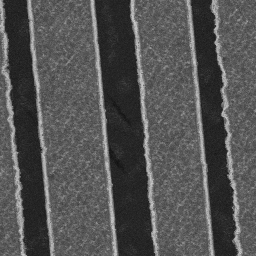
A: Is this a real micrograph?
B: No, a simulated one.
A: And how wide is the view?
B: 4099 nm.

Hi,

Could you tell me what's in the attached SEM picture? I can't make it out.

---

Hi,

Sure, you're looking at one or a few lines or trenches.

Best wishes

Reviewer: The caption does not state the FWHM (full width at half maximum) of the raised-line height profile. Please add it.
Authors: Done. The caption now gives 940 nm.